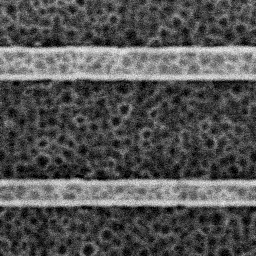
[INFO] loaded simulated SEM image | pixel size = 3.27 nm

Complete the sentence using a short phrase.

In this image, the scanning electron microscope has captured one or a few lines or trenches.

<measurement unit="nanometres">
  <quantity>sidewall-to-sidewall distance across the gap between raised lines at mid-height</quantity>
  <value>342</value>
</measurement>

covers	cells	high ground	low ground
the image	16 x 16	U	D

DDDDDDDDDDDDDDDD
DDDDDDDDDDDDDDDD
DDDDDDDDDDDDDDDD
UUUUUUUUUUUUUUUU
UUUUUUUUUUUUUUUU
DDDDDDDDDDDDDDDD
DDDDDDDDDDDDDDDD
DDDDDDDDDDDDDDDD
DDDDDDDDDDDDDDDD
DDDDDDDDDDDDDDDD
DDDDDDDDDDDDDDDD
UUUUUUUUUUUUUUUU
UUUUUUUUUUUUUUUU
DDDDDDDDDDDDDDDD
DDDDDDDDDDDDDDDD
DDDDDDDDDDDDDDDD